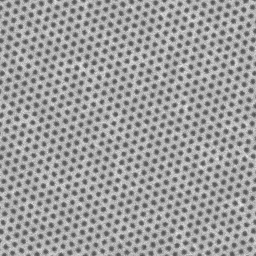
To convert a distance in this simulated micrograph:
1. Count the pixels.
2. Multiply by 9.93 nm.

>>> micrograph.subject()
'a regular array of holes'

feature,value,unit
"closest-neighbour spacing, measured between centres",87.8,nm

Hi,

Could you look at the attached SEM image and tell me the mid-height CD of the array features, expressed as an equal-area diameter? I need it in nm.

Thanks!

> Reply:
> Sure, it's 58.2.